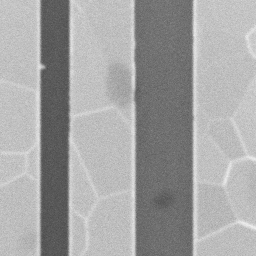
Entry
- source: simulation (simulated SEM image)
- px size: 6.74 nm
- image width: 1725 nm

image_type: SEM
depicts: lines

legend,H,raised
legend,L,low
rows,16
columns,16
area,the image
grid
HHLLHHHHLLLLHHHH
HHLLHHHHLLLLHHHH
HHLLHHHHLLLLHHHH
HHLLHHHHLLLLHHHH
HHLLHHHHLLLLHHHH
HHLLHHHHLLLLHHHH
HHLLHHHHLLLLHHHH
HHLLHHHHLLLLHHHH
HHLLHHHHLLLLHHHH
HHLLHHHHLLLLHHHH
HHLLHHHHLLLLHHHH
HHLLHHHHLLLLHHHH
HHLLHHHHLLLLHHHH
HHLLHHHHLLLLHHHH
HHLLHHHHLLLLHHHH
HHLLHHHHLLLLHHHH